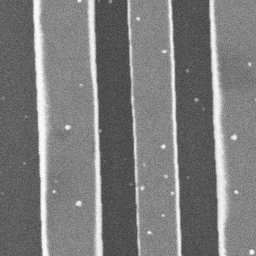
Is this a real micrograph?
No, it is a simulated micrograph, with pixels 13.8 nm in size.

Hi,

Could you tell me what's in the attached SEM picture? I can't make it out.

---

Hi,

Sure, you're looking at lines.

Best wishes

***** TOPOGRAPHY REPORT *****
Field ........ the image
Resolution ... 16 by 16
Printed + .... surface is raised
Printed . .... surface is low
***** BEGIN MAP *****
..++++..+++..+++
..++++..+++..+++
..++++..+++..+++
..++++..+++..+++
..++++..+++..+++
..++++..+++..+++
..++++..+++..+++
..++++..+++..+++
...+++..+++..+++
...+++..+++...++
...+++..+++...++
...+++..+++...++
...+++...++...++
...+++...++...++
...+++...++...++
...+++...++...++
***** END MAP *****